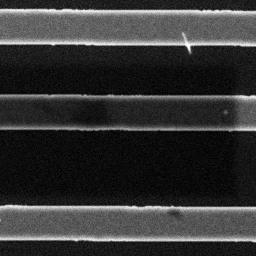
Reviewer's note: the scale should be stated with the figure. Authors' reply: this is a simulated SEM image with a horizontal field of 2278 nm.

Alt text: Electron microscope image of lines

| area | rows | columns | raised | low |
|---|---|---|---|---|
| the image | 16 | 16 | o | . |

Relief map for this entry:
................
oooooooooooooooo
oooooooooooooooo
................
................
................
oooooooooooooooo
oooooooooooooooo
................
................
................
................
................
oooooooooooooooo
oooooooooooooooo
................